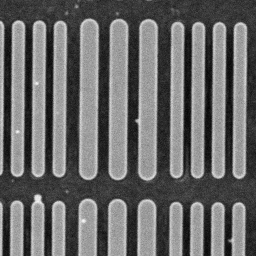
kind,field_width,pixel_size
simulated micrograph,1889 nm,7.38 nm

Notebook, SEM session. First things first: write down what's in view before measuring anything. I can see groups of lines, slits or small figures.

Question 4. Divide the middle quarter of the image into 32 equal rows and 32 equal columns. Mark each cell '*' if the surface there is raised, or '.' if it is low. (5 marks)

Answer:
....****....****...****....***..
....****....****...****....***..
....****....****...****....***..
....****....****...****....***..
....****....****...****....***..
....****....****...****....***..
....****....****...****....***..
....****....****...****....***..
....****....****...****....***..
....****....****...****....***..
....****....****...****....***..
....****....****...****....***..
....****....****...****....***..
....****...*****...****....***..
....****...*****...****....***..
....****...*****...****....***..
....****...*****...****....***..
....****...*****...****....***..
....****...*****...****....***..
....****...*****...****....***..
....****...*****...****....***..
....****...*****...****....***..
....****...*****...****....***..
....****...*****...****....***..
....****...*****...****....***..
....****...*****...****....***..
....****...*****...****....***..
....****...*****...****....***..
.....**.....***....***..........
................................
................................
................................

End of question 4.